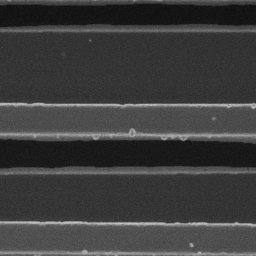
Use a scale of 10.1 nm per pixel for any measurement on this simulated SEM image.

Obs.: lines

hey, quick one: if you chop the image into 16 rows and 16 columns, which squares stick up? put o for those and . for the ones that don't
................
................
oooooooooooooooo
oooooooooooooooo
oooooooooooooooo
oooooooooooooooo
oooooooooooooooo
oooooooooooooooo
.ooooooooooooooo
................
................
oooooooooooooooo
oooooooooooooooo
oooooooooooooooo
oooooooooooooooo
oooooooooooooooo